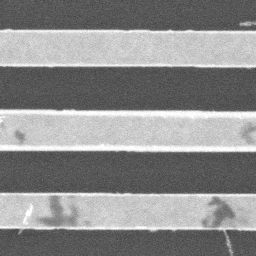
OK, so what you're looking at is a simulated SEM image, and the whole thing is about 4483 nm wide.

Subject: lines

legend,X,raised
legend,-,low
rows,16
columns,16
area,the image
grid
----------------
----------------
XXXXXXXXXXXXXXXX
XXXXXXXXXXXXXXXX
----------------
----------------
----------------
XXXXXXXXXXXXXXXX
XXXXXXXXXXXXXXXX
----------------
----------------
----------------
XXXXXXXXXXXXXXXX
XXXXXXXXXXXXXXXX
----------------
----------------